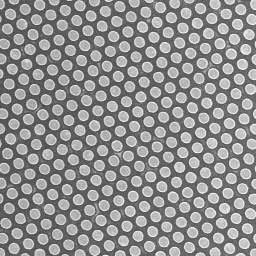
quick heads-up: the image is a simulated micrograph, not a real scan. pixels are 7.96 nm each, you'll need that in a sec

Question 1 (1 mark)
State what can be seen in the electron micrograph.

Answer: a regular array of raised bodies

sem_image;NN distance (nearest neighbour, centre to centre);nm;119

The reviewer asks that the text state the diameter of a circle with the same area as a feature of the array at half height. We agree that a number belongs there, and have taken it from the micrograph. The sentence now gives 84.2 nanometers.